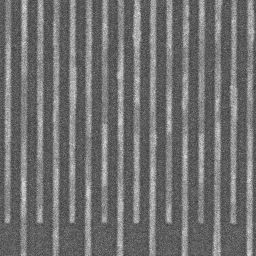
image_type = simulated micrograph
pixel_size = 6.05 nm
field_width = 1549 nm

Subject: parallel lines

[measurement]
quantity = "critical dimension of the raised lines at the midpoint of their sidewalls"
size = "28 nm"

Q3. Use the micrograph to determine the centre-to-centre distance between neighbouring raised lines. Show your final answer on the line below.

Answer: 97.8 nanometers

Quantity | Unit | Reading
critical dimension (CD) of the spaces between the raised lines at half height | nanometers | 66.6